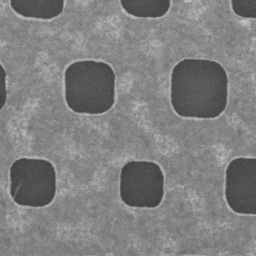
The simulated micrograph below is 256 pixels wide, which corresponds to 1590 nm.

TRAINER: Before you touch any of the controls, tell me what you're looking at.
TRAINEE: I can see holes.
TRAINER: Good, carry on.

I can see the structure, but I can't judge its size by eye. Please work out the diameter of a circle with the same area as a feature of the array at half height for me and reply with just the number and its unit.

0.333 µm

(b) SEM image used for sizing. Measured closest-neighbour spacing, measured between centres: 680 nm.